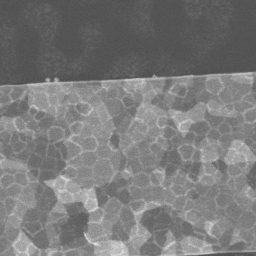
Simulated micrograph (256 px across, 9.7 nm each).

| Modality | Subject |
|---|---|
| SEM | one or a few lines or trenches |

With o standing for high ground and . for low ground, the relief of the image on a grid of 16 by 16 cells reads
................
................
................
................
................
oooooooooooooooo
oooooooooooooooo
oooooooooooooooo
oooooooooooooooo
oooooooooooooooo
oooooooooooooooo
oooooooooooooooo
oooooooooooooooo
oooooooooooooooo
oooooooooooooooo
oooooooooooooooo